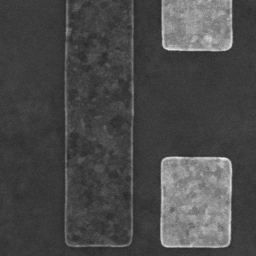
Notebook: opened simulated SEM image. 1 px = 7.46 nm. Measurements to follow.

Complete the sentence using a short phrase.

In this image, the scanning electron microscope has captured wiring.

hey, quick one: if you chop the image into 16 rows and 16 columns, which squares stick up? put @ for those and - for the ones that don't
----@@@@--@@@@--
----@@@@--@@@@--
----@@@@--@@@@--
----@@@@--------
----@@@@--------
----@@@@--------
----@@@@--------
----@@@@--------
----@@@@--------
----@@@@--------
----@@@@--@@@@--
----@@@@--@@@@--
----@@@@--@@@@--
----@@@@--@@@@--
----@@@@--@@@@--
----------------